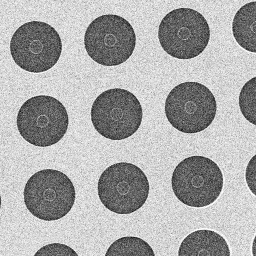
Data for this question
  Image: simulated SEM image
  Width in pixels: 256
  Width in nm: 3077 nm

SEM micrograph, an array of small figures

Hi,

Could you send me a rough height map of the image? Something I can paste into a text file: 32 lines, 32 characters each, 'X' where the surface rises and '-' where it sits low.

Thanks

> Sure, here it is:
XXXXXXXXXXXXXXXXXXXXXXXXXXXXXXX-
XXXXXXXXXXXXXXXXXXXXX----XXXXX--
XXXXXXXXXXXX----XXXX------XXX---
XX-----XXXX------XXX------XXX---
XX-----XXXX------XXX------XXX---
X-------XXX------XXX------XXXX--
X-------XXX------XXXX----XXXXXX-
XX-----XXXXX----XXXXXXXXXXXXXXXX
XXX---XXXXXXXXXXXXXXXXXXXXXXXXXX
XXXXXXXXXXXXXXXXXXXXXXXXXXXXXXXX
XXXXXXXXXXXXXXXXXXXXXX---XXXXXX-
XXXXXXXXXXXXX---XXXXX-----XXXX--
XXX----XXXXX-----XXXX------XXX--
XXX-----XXX-------XXX------XXX--
XX-------XX-------XXX------XXX--
XX-------XXX------XXX-----XXXXXX
XX------XXXX-----XXXXXX--XXXXXXX
XXX-----XXXXXX-XXXXXXXXXXXXXXXXX
XXXXXXXXXXXXXXXXXXXXXXXXXXXXXXXX
XXXXXXXXXXXXXXXXXXXXXXXX-XXXXXXX
XXXXXXXXXXXXXX---XXXXX-----XXXX-
XXXXX---XXXXX-----XXXX------XXX-
XXXX-----XXX-------XX-------XXX-
XXX------XXX-------XX-------XXX-
XXX------XXX-------XXX-----XXXXX
XXX------XXXX-----XXXXX---XXXXXX
XXXX-----XXXXX---XXXXXXXXXXXXXXX
XXXXX--XXXXXXXXXXXXXXXXXXXXXXXXX
XXXXXXXXXXXXXXXXXXXXXXXXXXXXXXXX
XXXXXXXXXXXXXXXXXXXXXXX-----XXXX
XXXXXX--XXXXXX-----XXXX------XX-
XXXXX----XXXX------XXX-------XX-